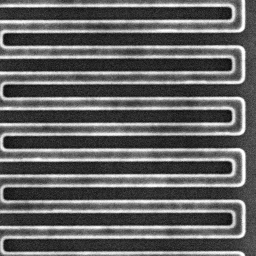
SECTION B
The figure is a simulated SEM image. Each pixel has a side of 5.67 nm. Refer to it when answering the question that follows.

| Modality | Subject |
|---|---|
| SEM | groups of lines, slits or small figures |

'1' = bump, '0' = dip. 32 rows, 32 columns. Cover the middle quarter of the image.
00000000000000000000000000000000
00000000000000000000000000000000
11111111111111111111111111111111
11111111111111111111111111111111
11111111111111111111111111111111
00000000000000000000000000000000
00000000000000000000000000000000
00000000000000000000000000000000
00000000000000000000000000000000
11111111111111111111111111111111
11111111111111111111111111111111
00000000000000000000000000000000
00000000000000000000000000000000
00000000000000000000000000000000
00000000000000000000000000000000
11111111111111111111111111111111
11111111111111111111111111111111
11111111111111111111111111111111
00000000000000000000000000000000
00000000000000000000000000000000
00000000000000000000000000000000
00000000000000000000000000000000
11111111111111111111111111111111
11111111111111111111111111111111
00000000000000000000000000000000
00000000000000000000000000000000
00000000000000000000000000000000
00000000000000000000000000000000
11111111111111111111111111111111
11111111111111111111111111111111
00000000000000000000000000000000
00000000000000000000000000000000